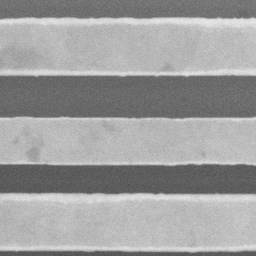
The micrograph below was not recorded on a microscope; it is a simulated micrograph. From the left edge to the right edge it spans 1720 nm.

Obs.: lines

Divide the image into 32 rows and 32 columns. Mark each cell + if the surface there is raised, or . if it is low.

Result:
................................
................................
.+++++++++++++++++++++++++.+++++
++++++++++++++++++++++++++++++++
++++++++++++++++++++++++++++++++
++++++++++++++++++++++++++++++++
++++++++++++++++++++++++++++++++
++++++++++++++++++++++++++++++++
++++++++++++++++++++++++++++++++
................................
................................
................................
................................
................................
................................
++++++++++++++++++++++++++++++++
++++++++++++++++++++++++++++++++
++++++++++++++++++++++++++++++++
++++++++++++++++++++++++++++++++
++++++++++++++++++++++++++++++++
......+++++++++++++++++........+
................................
................................
................................
++++++++++++++++++++++++++++++++
++++++++++++++++++++++++++++++++
++++++++++++++++++++++++++++++++
++++++++++++++++++++++++++++++++
++++++++++++++++++++++++++++++++
++++++++++++++++++++++++++++++++
++++++++++++++++++++++++++++++++
................................